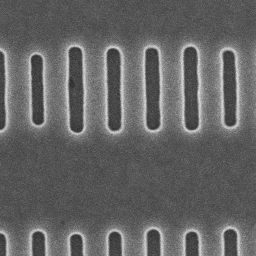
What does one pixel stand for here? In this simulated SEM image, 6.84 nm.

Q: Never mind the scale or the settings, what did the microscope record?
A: holes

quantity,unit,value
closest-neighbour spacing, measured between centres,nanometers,262